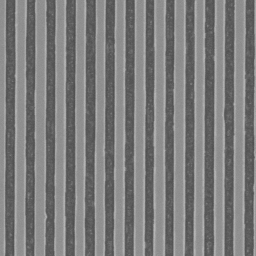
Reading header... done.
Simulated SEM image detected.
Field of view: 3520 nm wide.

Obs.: parallel lines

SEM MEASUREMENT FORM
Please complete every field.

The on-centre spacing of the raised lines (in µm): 0.274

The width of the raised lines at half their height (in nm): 138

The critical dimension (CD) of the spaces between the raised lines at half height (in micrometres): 0.138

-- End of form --